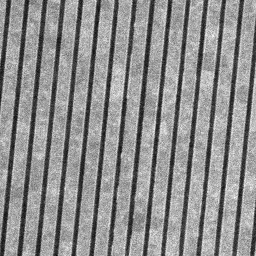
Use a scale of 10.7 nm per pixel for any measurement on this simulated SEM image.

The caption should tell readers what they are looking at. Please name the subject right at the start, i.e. parallel lines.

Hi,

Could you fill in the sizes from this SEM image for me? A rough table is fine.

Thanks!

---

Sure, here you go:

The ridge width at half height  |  0.13 micrometres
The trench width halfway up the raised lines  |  59.8 nanometres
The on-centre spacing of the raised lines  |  190 nm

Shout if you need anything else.